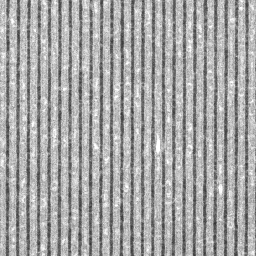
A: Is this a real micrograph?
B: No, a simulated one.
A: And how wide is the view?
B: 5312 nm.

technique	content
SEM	parallel lines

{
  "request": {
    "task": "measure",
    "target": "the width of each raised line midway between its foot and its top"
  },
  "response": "96 nanometres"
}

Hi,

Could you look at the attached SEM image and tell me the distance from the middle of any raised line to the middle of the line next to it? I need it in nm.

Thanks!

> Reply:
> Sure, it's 216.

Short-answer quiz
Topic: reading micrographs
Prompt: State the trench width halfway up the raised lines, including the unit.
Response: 117 nanometres